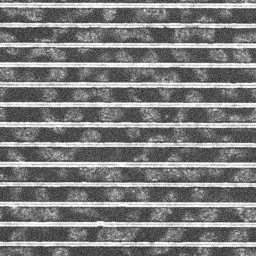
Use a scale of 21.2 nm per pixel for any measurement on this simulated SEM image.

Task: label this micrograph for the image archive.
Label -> parallel lines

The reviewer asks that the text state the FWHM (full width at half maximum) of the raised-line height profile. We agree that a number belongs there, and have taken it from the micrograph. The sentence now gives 55.6 nm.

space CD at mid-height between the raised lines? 355 nm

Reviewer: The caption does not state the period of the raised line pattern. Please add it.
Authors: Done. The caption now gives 421 nm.